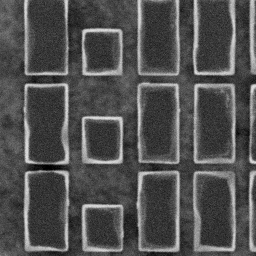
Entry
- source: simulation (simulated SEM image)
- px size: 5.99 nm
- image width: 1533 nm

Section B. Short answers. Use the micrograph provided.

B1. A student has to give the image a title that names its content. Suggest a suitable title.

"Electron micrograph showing wiring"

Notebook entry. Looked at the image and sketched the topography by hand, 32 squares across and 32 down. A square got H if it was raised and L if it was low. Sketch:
LLLHHHHHLLLLLLLLLLHHHHLLHHHHHLLL
LLLHHHHHLLLLLLLLLLHHHHLLLHHHHLLL
LLLHHHHHLLLLLLLLLLHHHHLLLHHHHLLL
LLLHHHHHLLLLLLLLLHHHHHLLLHHHHLLL
LLLHHHHHLLHHHHHLLHHHHHLLLHHHHLLL
LLLHHHHHLLHHHHHLLHHHHHLLHHHHHLLL
LLLHHHHHLLHHHHHLLHHHHHLLHHHHHLLL
LLLHHHHHLLLHHHHLLLHHHHLLHHHHHLLL
LLLHHHHHLLLHHHHLLLHHHHLLHHHHHLLL
LLLLLLLLLLLLLLLLLLLLLLLLLLLLLLLL
LLLLLLLLLLLLLLLLLLLLLLLLLLLLLLLL
LLLHHHHHLLLLLLLLLLHHHHLLLHHHHLLH
LLLHHHHHLLLLLLLLLHHHHHLLHHHHHLLH
LLLHHHHHLLLLLLLLLHHHHHLLHHHHHLLH
LLLHHHHHLLLLLLLLLLHHHHLLHHHHHLLH
LLLHHHHHLLHHHHHLLHHHHHLLLHHHHLLH
LLLHHHHHLLHHHHHLLHHHHHLLLHHHHLLH
LLLHHHHHLLLHHHHLLHHHHHLLLHHHHLLH
LLLHHHHHLLLHHHHLLLHHHHLLLHHHHLLH
LLLHHHHHLLLHHHHLLLHHHHLLLHHHHLLH
LLLLLLLLLLLLLLLLLLLLLLLLLLLLLLLL
LLLLHHHLLLLLLLLLLLLLLLLLLLLLLLLL
LLLHHHHHLLLLLLLLLLHHHHLLLHHHHLLH
LLLHHHHHLLLLLLLLLLHHHHLLHHHHHLLH
LLLHHHHHLLLLLLLLLHHHHHLLHHHHHLLH
LLLHHHHHLLLLLLLLLHHHHHLLHHHHHLLH
LLLHHHHHLLHHHHHLLLHHHHLLLHHHHLLL
LLLHHHHHLLLHHHHLLLHHHHLLLHHHHLLL
LLLHHHHHLLLHHHHLLLHHHHLLLHHHHLLL
LLLHHHHHLLLHHHHLLLHHHHLLLHHHHLLH
LLLHHHHHLLLHHHHLLLHHHHLLLHHHHLLH
LLLLLLLLLLLLLLLLLLLLLLLLLLLLLLLL